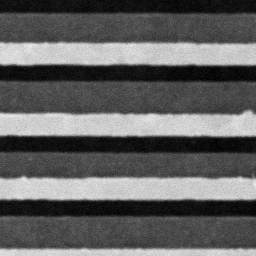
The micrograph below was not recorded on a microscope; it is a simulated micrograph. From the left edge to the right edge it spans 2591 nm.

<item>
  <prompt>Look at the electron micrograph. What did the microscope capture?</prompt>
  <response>lines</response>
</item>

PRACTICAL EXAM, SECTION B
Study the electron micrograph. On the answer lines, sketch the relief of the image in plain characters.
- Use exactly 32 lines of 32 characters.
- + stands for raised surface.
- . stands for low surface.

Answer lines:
................................
................................
++++++++++++++++++++++++++++++++
++++++++++++++++++++++++++++++++
++++++++++++++++++++++++++++++++
++++++++++++++++++++++++++++++++
++++++++++++++++++++++++++++++++
++++++++++++++++++++++++++++++++
................................
................................
++++++++++++++++++++++++++++++++
++++++++++++++++++++++++++++++++
++++++++++++++++++++++++++++++++
++++++++++++++++++++++++++++++++
++++++++++++++++++++++++++++++++
++++++++++++++++++++++++++++++++
++++++++++++++++++++++++++++++++
................................
................................
++++++++++++++++++++++++++++++++
++++++++++++++++++++++++++++++++
++++++++++++++++++++++++++++++++
++++++++++++++++++++++++++++++++
++++++++++++++++++++++++++++++++
++++++++++++++++++++++++++++++++
................................
................................
++++++++++++++++++++++++++++++++
++++++++++++++++++++++++++++++++
++++++++++++++++++++++++++++++++
++++++++++++++++++++++++++++++++
++++++++++++++++++++++++++++++++